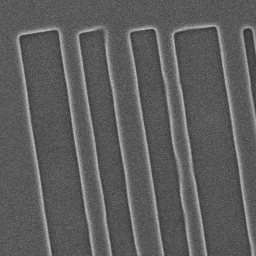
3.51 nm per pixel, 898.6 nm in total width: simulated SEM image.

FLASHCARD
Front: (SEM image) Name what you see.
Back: groups of lines, slits or small figures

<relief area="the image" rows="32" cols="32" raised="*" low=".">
********************************
********************************
********************************
*************************..*****
***....***...***....**.....***..
**......**...***....**.....****.
***.....**...****...**......***.
***.....**...****...**......***.
***.....**....***...**......***.
***.....**....***...**......***.
***.....***...***....**.....***.
***.....***...***....**.....***.
***......**...***....**......***
****.....**...****...**......***
****.....**...****...**......***
****.....***...***...**......***
****.....***...***...**......***
****.....***...***....**.....***
****.....***...***....**.....***
****......**...****...**......**
*****.....**...****...**......**
*****.....**....***...**......**
*****.....***...***...**......**
*****.....***...***....**.....**
*****.....***...***....**.....**
*****......**...***....**.....**
******.....**...****...**......*
******.....**...****...**......*
******.....**....***...**......*
******.....***...***...**......*
******.....***...***....**.....*
******......**...***....**......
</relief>